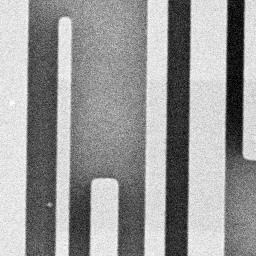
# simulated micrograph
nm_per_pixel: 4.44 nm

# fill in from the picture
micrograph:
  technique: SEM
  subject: groups of lines, slits or small figures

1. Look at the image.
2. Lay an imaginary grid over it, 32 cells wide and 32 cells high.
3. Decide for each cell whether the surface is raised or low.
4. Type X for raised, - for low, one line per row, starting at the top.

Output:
XXX----------------XX---XXXX---X
XXX----------------XX---XXXX---X
XXX-----X---------XXX---XXXX---X
XXX----XX---------XXX---XXXX---X
XXX----XX---------XXX---XXXX---X
XXX----XX---------XXX---XXXX---X
XXX----XX---------XXX---XXXX---X
XXX----XX---------XXX---XXXX---X
XXX----XX---------XXX---XXXX---X
XXX----XX---------XXX---XXXX---X
XXX----XX---------XXX---XXXX--XX
XXX----XX---------XXX---XXXX--XX
XXX----XX---------XXX---XXXX--XX
XXX----XX---------XXX---XXXX--XX
XXX----XX---------XXX---XXXX--XX
XXX----XX---------XXX---XXXX--XX
XXX----XX---------XXX---XXXX--XX
XXX----XX---------XXX---XXXX--XX
XXX----XX---------XXX---XXXX--XX
XXX----XX---------XXX---XXXX---X
XXX----XX---------XXX---XXXX----
XXX----XX---------XXX---XXXX----
XXX----XX---XX----XXX---XXXX----
XXX----XX--XXXX---XXX---XXXX----
XXX----XX--XXXX---XXX---XXXX----
XXX----XX--XXXX---XXX---XXXX----
XXX----XX--XXXX---XXX---XXXX----
XXX----XX--XXXX---XXX---XXXX----
XXX----XX--XXXX---XXX---XXXX----
XXX----XX--XXXX---XXX---XXXX----
XXX----XX--XXXX---XXX---XXXX----
XXX----X---XXXX---XXX---XXXX----